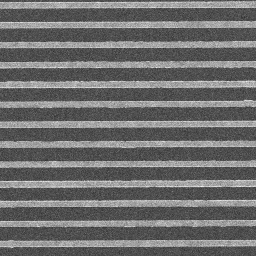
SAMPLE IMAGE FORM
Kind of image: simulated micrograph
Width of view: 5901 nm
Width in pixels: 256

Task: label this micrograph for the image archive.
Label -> parallel lines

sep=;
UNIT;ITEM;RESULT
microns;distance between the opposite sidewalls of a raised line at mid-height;0.133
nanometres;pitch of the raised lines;458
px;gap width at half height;14.4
